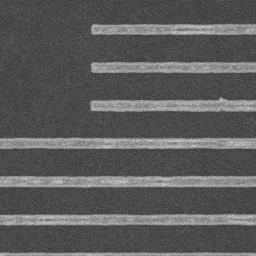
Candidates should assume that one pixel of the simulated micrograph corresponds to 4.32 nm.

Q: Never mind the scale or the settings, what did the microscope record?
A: parallel lines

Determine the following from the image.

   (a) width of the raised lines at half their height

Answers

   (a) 0.0405 micrometres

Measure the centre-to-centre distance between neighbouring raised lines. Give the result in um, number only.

0.165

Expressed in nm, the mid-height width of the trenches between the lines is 125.